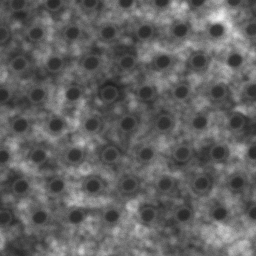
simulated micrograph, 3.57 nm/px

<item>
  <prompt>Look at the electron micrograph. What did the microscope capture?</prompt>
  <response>a regular array of raised bodies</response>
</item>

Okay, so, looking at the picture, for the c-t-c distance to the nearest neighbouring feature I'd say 125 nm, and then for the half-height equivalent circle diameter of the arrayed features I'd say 57.1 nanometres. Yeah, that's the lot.